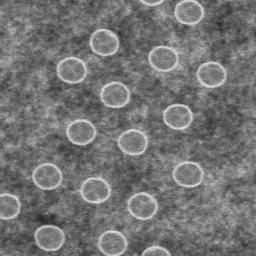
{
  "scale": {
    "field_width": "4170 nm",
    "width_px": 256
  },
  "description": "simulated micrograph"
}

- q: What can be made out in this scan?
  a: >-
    a regular array of raised bodies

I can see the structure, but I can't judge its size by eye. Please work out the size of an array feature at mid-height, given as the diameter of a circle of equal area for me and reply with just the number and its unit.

0.433 micrometres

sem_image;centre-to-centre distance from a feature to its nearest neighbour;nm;820